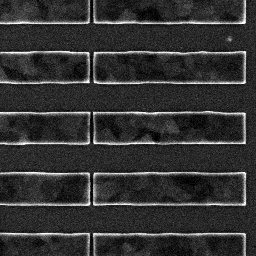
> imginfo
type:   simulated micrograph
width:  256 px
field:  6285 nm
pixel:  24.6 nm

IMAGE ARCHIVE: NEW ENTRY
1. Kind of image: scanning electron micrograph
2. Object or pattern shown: wiring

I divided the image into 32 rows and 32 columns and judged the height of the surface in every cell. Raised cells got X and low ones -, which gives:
XXXXXXXXXXXXXXXXXXXXXXXXXXXXXXX-
XXXXXXXXXXXXXXXXXXXXXXXXXXXXXXX-
XXXXXXXXXXX-XXXXXXXXXXXXXXXXXXX-
--------------------------------
--------------------------------
--------------------------------
---XXXXXX-------XXX-----XX---X--
XXXXXXXXXXX-XXXXXXXXXXXXXXXXXXX-
XXXXXXXXXXXXXXXXXXXXXXXXXXXXXXX-
XXXXXXXXXXX-XXXXXXXXXXXXXXXXXXX-
--------------------------------
--------------------------------
--------------------------------
--------------------------------
XXXXXXXXXXXXXXXXXXXXXXXXXXXXXXX-
XXXXXXXXXXX-XXXXXXXXXXXXXXXXXXX-
XXXXXXXXXXX-XXXXXXXXXXXXXXXXXXX-
XXXXXXXXXXX-XXXXXXXXXXXXXXXXXXX-
--------------------------------
--------------------------------
--------------------------------
--------------------------------
XXXXXXXXXXXXXXXXXXXXXXXXXXXXXXX-
XXXXXXXXXXXXXXXXXXXXXXXXXXXXXXX-
XXXXXXXXXXXXXXXXXXXXXXXXXXXXXXX-
XXXXXXXXXXX-XXXXXXXXXXXXXXXXXXX-
--------------------------------
--------------------------------
--------------------------------
XXXXXXXXXXX-XXXXXXXXXXXXXXXXXXX-
XXXXXXXXXXX-XXXXXXXXXXXXXXXXXXX-
XXXXXXXXXXX-XXXXXXXXXXXXXXXXXXX-